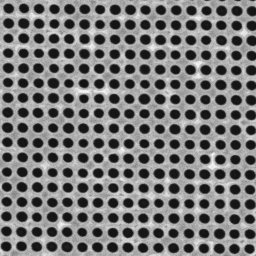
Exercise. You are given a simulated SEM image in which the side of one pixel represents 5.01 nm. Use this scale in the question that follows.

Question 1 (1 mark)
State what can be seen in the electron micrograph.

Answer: a regular array of holes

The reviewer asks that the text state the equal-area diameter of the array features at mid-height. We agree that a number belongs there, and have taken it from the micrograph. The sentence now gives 50.6 nanometers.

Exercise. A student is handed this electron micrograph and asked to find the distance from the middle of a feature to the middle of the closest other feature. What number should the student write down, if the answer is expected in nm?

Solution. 73.8